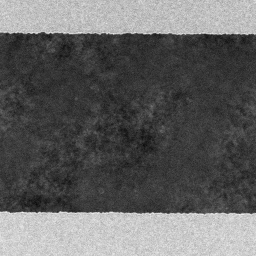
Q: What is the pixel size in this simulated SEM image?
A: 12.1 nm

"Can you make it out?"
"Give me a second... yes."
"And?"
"one or a few lines or trenches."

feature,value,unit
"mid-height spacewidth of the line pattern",2180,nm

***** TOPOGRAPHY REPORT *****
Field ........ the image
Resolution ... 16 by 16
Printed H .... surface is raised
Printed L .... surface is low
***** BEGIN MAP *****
HHHHHHHHHHHHHHHH
HHHHHHHHHHHHHHHH
LLLLLLLLLLLLLLLL
LLLLLLLLLLLLLLLL
LLLLLLLLLLLLLLLL
LLLLLLLLLLLLLLLL
LLLLLLLLLLLLLLLL
LLLLLLLLLLLLLLLL
LLLLLLLLLLLLLLLL
LLLLLLLLLLLLLLLL
LLLLLLLLLLLLLLLL
LLLLLLLLLLLLLLLL
LLLLLLLLLLLLLLLL
HHHHHHHHHHHHHHHH
HHHHHHHHHHHHHHHH
HHHHHHHHHHHHHHHH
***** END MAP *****